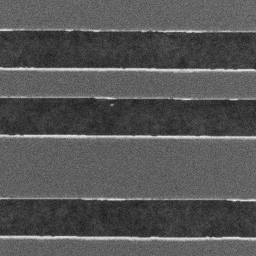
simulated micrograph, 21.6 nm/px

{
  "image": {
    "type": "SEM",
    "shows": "lines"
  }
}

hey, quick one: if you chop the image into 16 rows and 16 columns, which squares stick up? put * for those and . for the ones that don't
****************
****************
................
................
****************
****************
................
................
................
****************
****************
****************
................
................
................
****************